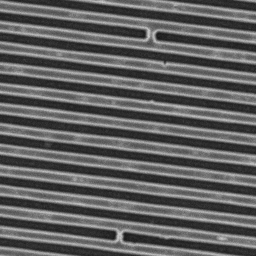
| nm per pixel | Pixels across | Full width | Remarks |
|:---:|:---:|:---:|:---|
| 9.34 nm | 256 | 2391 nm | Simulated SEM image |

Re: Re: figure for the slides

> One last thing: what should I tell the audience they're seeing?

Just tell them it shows parallel lines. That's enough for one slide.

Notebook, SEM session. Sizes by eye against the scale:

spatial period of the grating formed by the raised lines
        20.4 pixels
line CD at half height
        96.2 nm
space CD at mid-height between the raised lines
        96.2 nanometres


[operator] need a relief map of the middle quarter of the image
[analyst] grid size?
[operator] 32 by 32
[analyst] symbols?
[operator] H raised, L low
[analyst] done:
LLLLLLLLLLLLLHHHHHHHHHHHHHHHHHHH
LLLLLLLLLLLLLLLLLLLLLHHHHHHHHHHH
HHHHHHLLLLLLLLLLLLLLLLLLLLLLLHHH
HHHHHHHHHHHHHHLLLLLLLLLLLLLLLLLL
LLLLHHHHHHHHHHHHHHHHHHLLLLLLLLLL
LLLLLLLLLLLLLHHHHHHHHHHHHHHHHHLL
LLLLLLLLLLLLLLLLLLLLHHHHHHHHHHHH
HHHHHHLLLLLLLLLLLLLLLLLLLLLHHHHH
HHHHHHHHHHHHHLLLLLLLLLLLLLLLLLLL
LHHHHHHHHHHHHHHHHHHHHHLLLLLLLLLL
LLLLLLLLLHHHHHHHHHHHHHHHHHHHHHLL
LLLLLLLLLLLLLLLLLHHHHHHHHHHHHHHH
HHHHHLLLLLLLLLLLLLLLLLLLLLLHHHHH
HHHHHHHHHHHHHLLLLLLLLLLLLLLLLLLL
LHHHHHHHHHHHHHHHHHHHHLLLLLLLLLLL
LLLLLLLLLLLHHHHHHHHHHHHHHHHHHLLL
LLLLLLLLLLLLLLLLLLHHHHHHHHHHHHHH
HHHLLLLLLLLLLLLLLLLLLLLLLLLHHHHH
HHHHHHHHHHHHHLLLLLLLLLLLLLLLLLLL
HHHHHHHHHHHHHHHHHHHHHLLLLLLLLLLL
LLLLLLLHHHHHHHHHHHHHHHHHHHHHHLLL
LLLLLLLLLLLLLLLHHHHHHHHHHHHHHHHH
HHHLLLLLLLLLLLLLLLLLLLLLHHHHHHHH
HHHHHHHHHHHLLLLLLLLLLLLLLLLLLLLL
HHHHHHHHHHHHHHHHHHHLLLLLLLLLLLLL
LLLLLLLLHHHHHHHHHHHHHHHHHHHLLLLL
LLLLLLLLLLLLLLLLHHHHHHHHHHHHHHHH
HLLLLLLLLLLLLLLLLLLLLLLLHHHHHHHH
HHHHHHHHHLHLLLLLLLLLLLLLLLLLLLLL
HHHHHHHHHHHHHHHHHHHLLLLLLLLLLLLL
LLLLLLHHHHHHHHHHHHHHHHHHHLLLLLLL
LLLLLLLLLLLLLLLHHHHHHHHHHHHHHHHH